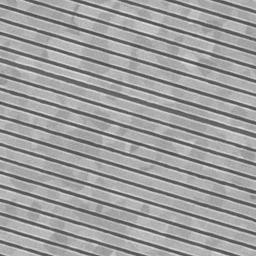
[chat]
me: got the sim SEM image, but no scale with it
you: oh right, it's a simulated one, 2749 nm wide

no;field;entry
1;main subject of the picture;parallel lines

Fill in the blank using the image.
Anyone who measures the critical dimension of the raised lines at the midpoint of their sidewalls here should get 100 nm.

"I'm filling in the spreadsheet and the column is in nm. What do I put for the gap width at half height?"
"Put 46.4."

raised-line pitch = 143 nm